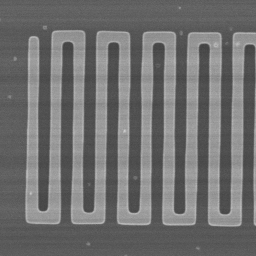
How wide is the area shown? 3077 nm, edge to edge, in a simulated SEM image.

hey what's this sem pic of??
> groups of lines, slits or small figures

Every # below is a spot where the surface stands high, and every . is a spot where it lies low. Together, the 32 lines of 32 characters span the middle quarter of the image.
...##...###...##....##...###...#
...##...###...##....##...###...#
...##...###...##....##...###...#
...##...###...##...###...###...#
...##...###...##...###...###...#
...##...###...##...###...###...#
...##...###...##...###...###...#
...##...###...##....##...###...#
...##...###...##....##...###...#
...##...###...##....##...###...#
...##...###...##....##...###...#
..###...###...##....##...###...#
..###...###...##....##...###...#
..###...###...##....##...###...#
..###...###...##....##...###...#
..###...###...##....##...###...#
..###...###...##....##...###...#
..###...###...##....##...###...#
..###...###...##...###...###...#
..###...###...##...###...###...#
..###...##....##...###...###...#
..###...##....##...###...###..##
..###...##....##...###...###..##
..###...##....##...###...###..##
..###...##....##...###...###..##
..###...##....##...###...###..##
..###...##....##...###...###..##
..###...##....##...###...###..##
..###...##....##...###...###..##
..###...##....##...###...###..##
..###...##....##...###...###..##
..###...##....##...###...##...##